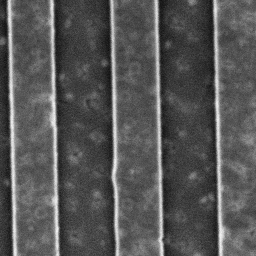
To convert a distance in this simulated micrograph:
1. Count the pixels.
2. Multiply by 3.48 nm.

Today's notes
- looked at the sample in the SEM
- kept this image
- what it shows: one or a few lines or trenches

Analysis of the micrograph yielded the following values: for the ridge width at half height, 155 nanometres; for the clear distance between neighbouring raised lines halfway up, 203 nm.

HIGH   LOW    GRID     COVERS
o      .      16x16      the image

.oo....ooo...ooo
.oo....ooo...ooo
.oo....ooo...ooo
.oo....ooo....oo
.oo....ooo....oo
.oo....ooo....oo
.oo....ooo....oo
.oo....ooo....oo
.oo....ooo....oo
.oo....ooo....oo
.oo....ooo....oo
.ooo...ooo....oo
.ooo...ooo....oo
.ooo...ooo....oo
.ooo...ooo....oo
.ooo...ooo....oo